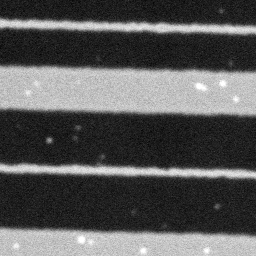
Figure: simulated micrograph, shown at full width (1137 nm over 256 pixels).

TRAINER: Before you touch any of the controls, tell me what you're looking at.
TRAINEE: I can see lines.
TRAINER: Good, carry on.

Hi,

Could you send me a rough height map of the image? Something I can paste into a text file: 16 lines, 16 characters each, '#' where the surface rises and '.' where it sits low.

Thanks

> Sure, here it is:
................
................
................
................
#############...
################
################
................
................
................
................
................
................
................
#####...........
################